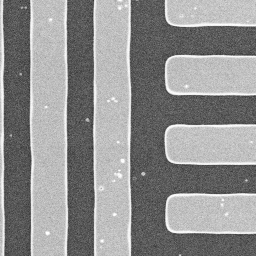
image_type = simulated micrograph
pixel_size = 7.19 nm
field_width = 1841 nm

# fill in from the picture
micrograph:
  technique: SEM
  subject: groups of lines, slits or small figures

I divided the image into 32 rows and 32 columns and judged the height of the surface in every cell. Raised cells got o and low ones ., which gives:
....oooo....oooo.....ooooooooooo
....oooo....oooo.....ooooooooooo
....oooo....oooo.....ooooooooooo
....oooo....oooo................
....oooo....oooo................
....oooo....oooo................
....oooo....oooo................
....oooo....oooo.....ooooooooooo
....oooo....oooo.....ooooooooooo
....oooo....oooo.....ooooooooooo
....oooo....oooo.....ooooooooooo
....oooo....oooo.....ooooooooooo
....oooo....oooo................
....oooo....oooo................
....oooo....oooo................
....oooo....oooo................
....oooo....oooo.....ooooooooooo
....oooo....oooo.....ooooooooooo
....oooo....oooo.....ooooooooooo
....oooo....oooo.....ooooooooooo
....oooo....oooo........ooo.....
....oooo....oooo................
....oooo....oooo................
....oooo....oooo................
....oooo....oooo.....ooooooooooo
....oooo....oooo.....ooooooooooo
....oooo....oooo.....ooooooooooo
o...oooo....oooo.....ooooooooooo
o...oooo....oooo.....ooooooooooo
o...oooo....oooo................
o...oooo....oooo................
....oooo....oooo................